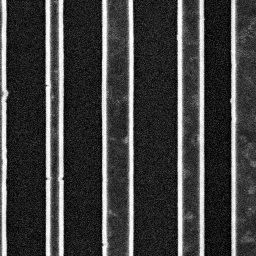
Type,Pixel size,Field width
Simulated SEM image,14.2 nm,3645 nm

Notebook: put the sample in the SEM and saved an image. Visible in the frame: one or a few lines or trenches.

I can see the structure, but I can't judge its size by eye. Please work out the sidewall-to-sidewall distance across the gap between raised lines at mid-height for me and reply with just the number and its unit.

604 nm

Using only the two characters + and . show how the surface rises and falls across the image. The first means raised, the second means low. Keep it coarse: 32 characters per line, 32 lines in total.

+.....++.....+++......+++....+++
+.....++.....+++......+++....+++
+.....++.....+++......+++....+++
+.....++.....+++......+++....+++
+.....++.....+++......+++....+++
+.....++.....+++......+++....+++
+.....++.....+++......+++....+++
+.....++.....+++......+++....+++
+.....++.....+++......+++....+++
+.....++.....+++......+++....+++
+.....++.....+++......+++....+++
+.....++.....+++......+++....+++
+.....++.....+++......+++....+++
+.....++.....+++......+++....+++
+.....++.....+++......+++....+++
+.....++.....+++......+++....+++
+.....++.....+++......+++....+++
+.....++.....+++......+++....+++
+.....++.....+++......+++....+++
+.....++.....+++......+++....+++
+.....++.....+++......+++....+++
+.....++.....+++......+++....+++
+.....++.....+++......+++....+++
+.....++.....+++......+++....+++
+.....++.....+++......+++....+++
+.....++.....+++......+++....+++
+.....++.....+++......+++....+++
+.....++.....+++......+++....+++
+.....++.....+++......+++....+++
+.....++.....+++......+++....+++
+.....++.....+++......+++....+++
+.....++.....+++......+++....+++